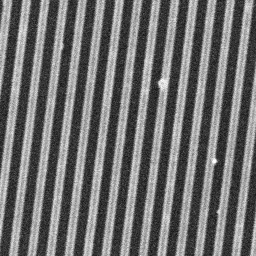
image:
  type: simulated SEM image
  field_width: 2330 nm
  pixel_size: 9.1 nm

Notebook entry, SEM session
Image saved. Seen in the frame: parallel lines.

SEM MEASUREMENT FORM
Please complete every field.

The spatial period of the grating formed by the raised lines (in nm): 168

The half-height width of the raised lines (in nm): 59.8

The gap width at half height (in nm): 103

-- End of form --